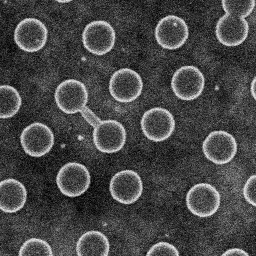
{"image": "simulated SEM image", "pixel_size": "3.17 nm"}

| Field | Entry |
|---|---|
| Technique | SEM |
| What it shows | a regular array of raised bodies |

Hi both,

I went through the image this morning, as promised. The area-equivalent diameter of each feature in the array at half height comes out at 102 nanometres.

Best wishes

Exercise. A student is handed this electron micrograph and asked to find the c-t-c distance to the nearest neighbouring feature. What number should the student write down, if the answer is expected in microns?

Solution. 0.17